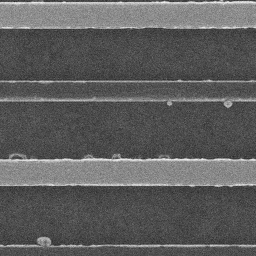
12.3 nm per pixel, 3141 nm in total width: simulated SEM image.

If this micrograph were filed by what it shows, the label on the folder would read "lines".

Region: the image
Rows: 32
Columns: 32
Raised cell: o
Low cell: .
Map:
oooooooooooooooooooooooooooooooo
oooooooooooooooooooooooooooooooo
oooooooooooooooooooooooooooooooo
................................
................................
................................
................................
................................
................................
................................
oooooooooooooooooooooooooooooooo
oooooooooooooooooooooooooooooooo
................................
................................
................................
................................
................................
................................
................................
................................
oooooooooooooooooooooooooooooooo
oooooooooooooooooooooooooooooooo
oooooooooooooooooooooooooooooooo
................................
................................
................................
................................
................................
................................
................................
.....o..........................
oooooooooooooooooooooooooooooooo